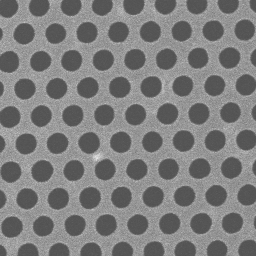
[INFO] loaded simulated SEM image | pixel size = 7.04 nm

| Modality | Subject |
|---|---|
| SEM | a regular array of holes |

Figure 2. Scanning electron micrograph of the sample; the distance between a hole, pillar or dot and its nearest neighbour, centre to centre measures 220 nm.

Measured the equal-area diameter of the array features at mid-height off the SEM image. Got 152 nm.